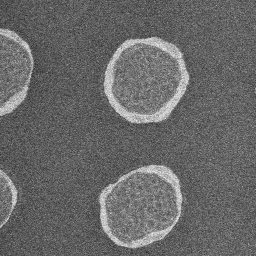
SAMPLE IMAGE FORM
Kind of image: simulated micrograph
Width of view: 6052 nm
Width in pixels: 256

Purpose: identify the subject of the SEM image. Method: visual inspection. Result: raised bodies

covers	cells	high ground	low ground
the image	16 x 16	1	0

0000000000000000
0000000000000000
1000000000000000
1100000111100000
1100000111110000
1100000111100000
1000000111100000
0000000000000000
0000000000000000
0000000000000000
0000000000000000
1000000111100000
1000001111100000
1000001111100000
0000000111000000
0000000000000000